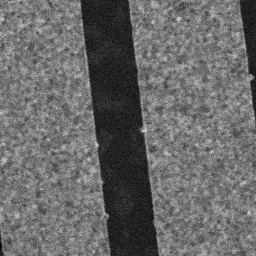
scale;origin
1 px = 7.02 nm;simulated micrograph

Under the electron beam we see one or a few lines or trenches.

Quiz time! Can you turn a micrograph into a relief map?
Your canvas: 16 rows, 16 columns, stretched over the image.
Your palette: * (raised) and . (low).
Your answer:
*****...*******.
*****...*******.
*****...*******.
*****...*******.
*****....*******
******...*******
******...*******
******...*******
******...*******
******...*******
******...*******
******...*******
******....******
*******...******
*******...******
*******...******